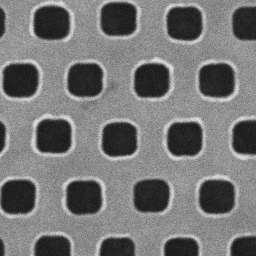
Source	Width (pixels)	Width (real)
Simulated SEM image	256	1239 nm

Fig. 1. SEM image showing a regular array of holes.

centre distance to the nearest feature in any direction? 314 nm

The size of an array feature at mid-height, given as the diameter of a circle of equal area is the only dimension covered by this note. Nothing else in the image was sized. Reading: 176 nm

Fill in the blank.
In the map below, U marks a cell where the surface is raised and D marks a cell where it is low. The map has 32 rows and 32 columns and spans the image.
UUUUUUUUUUUUUDDDUUUUUUUUUUUUUUUU
UUUUDDDDUUUUUDDDDUUUUDDDDUUUUDDD
DUUUDDDDDUUUUDDDDUUUUDDDDUUUUDDD
DUUUDDDDDUUUUDDDDUUUUDDDDUUUUDDD
UUUUUDDDUUUUUUUUUUUUUDDDDUUUUDDD
UUUUUUUUUUUUUUUUUUUUUUUUUUUUUUUU
UUUUUUUUUUUUUUUUUUUUUUUUUUUUUUUU
UUUUUUUUUUUUUUUUUUUUUUUUUUUUUUUU
UDDDUUUUUDDDDUUUUDDDDUUUUDDDDUUU
DDDDDUUUDDDDDUUUUDDDDUUUUDDDDUUU
DDDDDUUUDDDDDUUUUDDDDUUUUDDDDUUU
UDDDUUUUUDDDDUUUUDDDDUUUUDDDDUUU
UUUUUUUUUUUUUUUUUUUUUUUUUUUUUUUU
UUUUUUUUUUUUUUUUUUUUUUUUUUUUUUUU
UUUUUUUUUUUUUUUUUUUUUUUUUUUUUUUU
UUUUUDDDDUUUUUDDUUUUUUDDDUUUUUDD
DUUUUDDDDUUUUDDDDUUUUDDDDUUUUDDD
DUUUUDDDDUUUUDDDDUUUUDDDDUUUUDDD
UUUUUDDDDUUUUDDDDUUUUDDDDUUUUDDD
UUUUUUUUUUUUUUDDUUUUUUDDUUUUUUUU
UUUUUUUUUUUUUUUUUUUUUUUUUUUUUUUU
UUUUUUUUUUUUUUUUUUUUUUUUUUUUUUUU
UUDUUUUUUUUUUUUUUUDDUUUUUUDDUUUU
DDDDUUUUDDDDDUUUUDDDDUUUUDDDDUUU
DDDDUUUUDDDDDUUUUDDDDUUUUDDDDUUU
DDDDUUUUDDDDDUUUUDDDDUUUUDDDDUUU
UDDDUUUUUDDDUUUUUUDDUUUUUUDDUUUU
UUUUUUUUUUUUUUUUUUUUUUUUUUUUUUUU
UUUUUUUUUUUUUUUUUUUUUUUUUUUUUUUU
UUUUUUDUUUUUUUUUUUUUUUUUUUUUUUUU
UUUUDDDDDUUUUDDDDUUUUDDDDUUUUDDD
DUUUDDDDDUUUUDDDDUUUUDDDDUUUUDDD